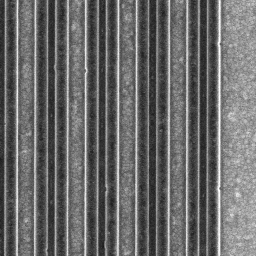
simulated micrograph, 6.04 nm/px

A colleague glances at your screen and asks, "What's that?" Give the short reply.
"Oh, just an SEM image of parallel lines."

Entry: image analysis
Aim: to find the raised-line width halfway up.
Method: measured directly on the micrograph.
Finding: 77.7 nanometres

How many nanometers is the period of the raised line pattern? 152